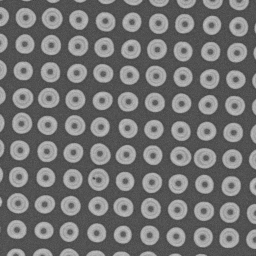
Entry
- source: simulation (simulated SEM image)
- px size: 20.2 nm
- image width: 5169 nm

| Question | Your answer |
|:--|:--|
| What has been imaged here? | an array of small figures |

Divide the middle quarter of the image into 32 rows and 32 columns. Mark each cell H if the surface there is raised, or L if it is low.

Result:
LLHHHLLLHHHLLLLHLLLLLLLLLLLLLLLL
LHHHHHLHHHHHLLHHHHLLLHHHHLLLHHHL
LHHHHHLHHHHHLLHHHHHLHHHHHLLLHHHH
LHHHHLLLHHHHLLHHHHHLLHHHHLLHHHHH
LLHHLLLLLHHLLLLHHHLLLHHHHLLLHHHH
LLLLLLLLLLLLLLLLLLLLLLHLLLLLLHHL
LLHLLLLLLLLLLLLLLLLLLLLLLLLLLLLL
LHHHHLLLHHHLLLHHHLLLLLHHLLLLLHLL
LHHHHLLHHHHHLLHHHHLLLHHHHLLHHHHL
HHHHHLLHHHHHLLHHHHLLHHHHHLLHHHHH
LHHHHLLLHHHLLLHHHHLLHHHHHLLHHHHH
LLLLLLLLLLLLLLLHHLLLLHHHLLLHHHHL
LLLLLLLLLLLLLLLLLLLLLLLLLLLLLLLL
LHHHLLLLLHLLLLLLLLLLLLLLLLLLLLLL
HHHHHLLHHHHLLLHHHHLLLHHHLLLLHHLL
HHHHHLLHHHHLLLHHHHLLHHHHHLLHHHHL
LHHHHLLHHHHLLLHHHHLLHHHHHLLHHHHH
LLHHLLLLHHHLLLHHHHLLHHHHHLLHHHHH
LLLLLLLLLLLLLLLLLLLLLHHHLLLLHHHL
LLLLLLLLLLLLLLLLLLLLLLLLLLLLLLLL
LHHHLLLHHHLLLLLHHLLLLHHLLLLLLLLL
HHHHHLLHHHHLLLHHHHLLHHHHLLLHHHHL
HHHHHLLHHHHHLHHHHHLLHHHHHLLHHHHH
HHHHLLLHHHHHLHHHHHLLHHHHLLLHHHHH
LLHLLLLHHHHLLLHHHLLLLHHHLLLHHHHL
LLLLLLLLLLLLLLLLLLLLLLLLLLLLLLLL
LHHLLLLHHHLLLLLLLLLLLLLLLLLLLLLL
HHHHLLLHHHHLLLHHHLLLLHHLLLLLLLLL
HHHHHLHHHHHLLHHHHLLLHHHHLLLHHHHL
HHHHHLHHHHHLLHHHHLLLHHHHLLHHHHHL
HHHHLLLHHHHLLHHHHLLLHHHHLLHHHHHL
LLLLLLLLHLLLLLHHLLLLHHHHLLLHHHLL